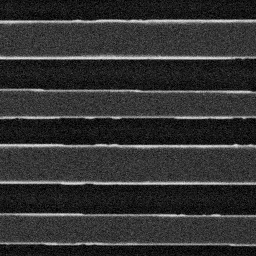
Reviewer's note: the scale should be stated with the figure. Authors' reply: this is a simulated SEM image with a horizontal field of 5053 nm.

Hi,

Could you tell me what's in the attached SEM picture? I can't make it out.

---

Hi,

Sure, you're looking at lines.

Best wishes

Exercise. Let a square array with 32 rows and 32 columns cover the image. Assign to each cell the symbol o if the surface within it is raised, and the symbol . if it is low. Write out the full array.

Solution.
................................
................................
................................
oooooooooooooooooooooooooooooooo
oooooooooooooooooooooooooooooooo
oooooooooooooooooooooooooooooooo
oooooooooooooooooooooooooooooooo
................................
................................
................................
................................
oooooooooooooooooooooooooooooooo
oooooooooooooooooooooooooooooooo
oooooooooooooooooooooooooooooooo
oooooooooooooooooooooooooooooooo
................................
................................
................................
oooooooooooooooooooooooooooooooo
oooooooooooooooooooooooooooooooo
oooooooooooooooooooooooooooooooo
oooooooooooooooooooooooooooooooo
oooooooooooooooooooooooooooooooo
................................
................................
................................
................................
oooooooooooooooooooooooooooooooo
oooooooooooooooooooooooooooooooo
oooooooooooooooooooooooooooooooo
.....ooooooooooooooooooooooooooo
................................